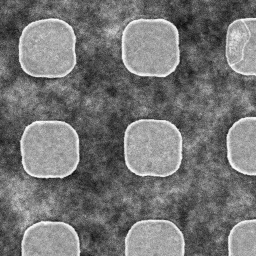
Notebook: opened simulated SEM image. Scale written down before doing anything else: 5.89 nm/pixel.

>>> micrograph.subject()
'raised bodies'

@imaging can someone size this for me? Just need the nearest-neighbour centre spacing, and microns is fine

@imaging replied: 0.592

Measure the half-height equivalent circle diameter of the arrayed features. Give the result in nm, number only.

355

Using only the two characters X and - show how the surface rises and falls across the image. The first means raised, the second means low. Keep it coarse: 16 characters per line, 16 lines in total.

----------------
--XX----XXX----X
-XXXX---XXX----X
-XXXX---XXX----X
--XX----XXX----X
----------------
----------------
---------X-----X
-XXXX---XXX---XX
-XXXX---XXX---XX
--XXX---XXX----X
----------------
----------------
----------------
--XXX---XXX---XX
-XXXX---XXX---XX